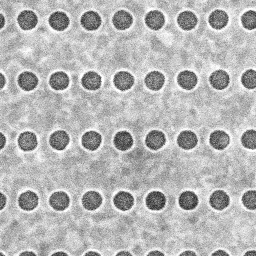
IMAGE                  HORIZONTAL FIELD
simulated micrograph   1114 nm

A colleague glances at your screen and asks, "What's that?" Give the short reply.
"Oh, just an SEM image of a regular array of holes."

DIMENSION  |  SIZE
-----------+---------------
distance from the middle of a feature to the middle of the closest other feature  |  0.138 microns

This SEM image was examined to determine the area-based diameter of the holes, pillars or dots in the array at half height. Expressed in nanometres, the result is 93.6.